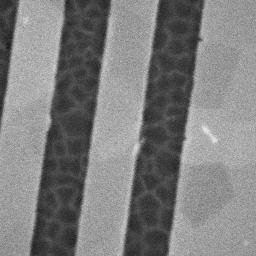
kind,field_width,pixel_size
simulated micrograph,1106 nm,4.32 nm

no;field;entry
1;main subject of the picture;one or a few lines or trenches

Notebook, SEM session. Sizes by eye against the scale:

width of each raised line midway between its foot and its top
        195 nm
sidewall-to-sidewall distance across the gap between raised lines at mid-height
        203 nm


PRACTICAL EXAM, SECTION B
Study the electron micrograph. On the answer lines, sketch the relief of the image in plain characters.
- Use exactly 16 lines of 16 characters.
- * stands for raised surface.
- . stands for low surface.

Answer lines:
.***...***...***
.***...***...***
.***...***...***
.***...**...****
***...***...****
***...***...****
***...***...****
***...***...****
***...***...****
***...***..*****
***...**...*****
**...***...*****
**...***...*****
**...***...*****
**...***...*****
**...***...*****